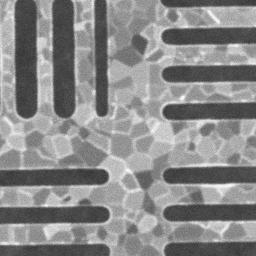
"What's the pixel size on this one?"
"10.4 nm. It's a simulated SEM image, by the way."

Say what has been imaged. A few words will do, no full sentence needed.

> groups of lines, slits or small figures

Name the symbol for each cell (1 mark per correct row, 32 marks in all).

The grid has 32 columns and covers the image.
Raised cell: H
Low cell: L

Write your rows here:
HHLLLHLLLHHHLHHHHHHHLLLLLLLLLLLL
HHLLLHLLLHHHLHHHHHHHHHHHHHHHHHHH
HHLLLHLLLHHHLHHHHHHHHHHHHHHHHHHH
HHLLLHLLLHHHLLHHHHHHHLLLLLLLLLLL
HHLLLHLLLHHHLLHHHHHHLLLLLLLLLLLL
HHLLLHLLLHHHLLHHHHHHHLLLLLLLLLLL
HHLLLHLLLHHHLLHHHHHHHHHHHHHHHHHH
HHLLLHLLLHHHLLHHHHHHHHHHHHHHHHHH
HHLLLHLLLHHHLLHHHHHHLLLLLLLLLLLL
HHLLLHLLLHHHLLHHHHHHLLLLLLLLLLLL
HHLLLHHLLLHHLLHHHHHHHHHHHHHHHHHH
HHLLLHHLLLHHLLHHHHHHHHHHHHHHHHHH
HHLLLHHLLLHHLLHHHHHHHHHHHHHHHHHH
HHLLLHHLLHHHLLHHHHHHLLLLLLLLLLLL
HHLLHHHLLHHHLHHHHHHHLLLLLLLLLLLL
HHHHHHHHHHHHHHHHHHHHHHHHHHHHHHHH
HHHHHHHHHHHHHHHHHHHHHHHHHHHHHHHH
HHHHHHHHHHHHHHHHHHHHHHHHHHHHHHHH
HHHHHHHHHHHHHHHHHHHHHHHHHHHHHHHH
HHHHHHHHHHHHHHHHHHHHHHHHHHHHHHHH
HHHHHHHHHHHHHHHHHHHHHHHHHHHHHHHH
LLLLLLLLLLLLLHHHHHHHLLLLLLLLLLLL
LLLLLLLLLLLLLLHHHHHHLLLLLLLLLLLL
LLLLHHHHHHHHHHHHHHHHHHHHHHHHHHHH
HHHHHHHHHHHHHHHHHHHHHHHHHHHHHHHH
HHHHHHHHHHHHHHHHHHHHHHLLLLLLLLLL
LLLLLLLLLLLLLLHHHHHHLLLLLLLLLLLL
LLLLLLLLLLLLLLHHHHHHHLLLLLLLLLLL
HHHHHHHHHHHHHHHHHHHHHHHHHHHHHHHH
HHHHHHHHHHHHHHHHHHHHHHHHHHHHHHHH
LLLLLLLLLLLLLHHHHHHHHLLLLLLLLLLL
LLLLLLLLLLLLLLHHHHHHLLLLLLLLLLLL